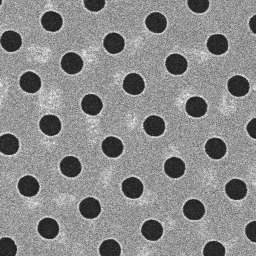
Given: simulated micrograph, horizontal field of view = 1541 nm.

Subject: a regular array of holes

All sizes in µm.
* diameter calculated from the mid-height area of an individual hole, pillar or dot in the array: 0.131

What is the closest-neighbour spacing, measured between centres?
276 nanometers